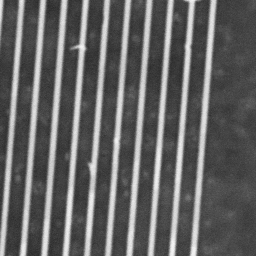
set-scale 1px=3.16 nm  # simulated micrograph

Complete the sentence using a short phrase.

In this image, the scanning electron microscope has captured parallel lines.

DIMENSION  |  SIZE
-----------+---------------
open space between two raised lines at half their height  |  53.9 nanometers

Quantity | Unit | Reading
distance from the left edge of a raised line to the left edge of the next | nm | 67.1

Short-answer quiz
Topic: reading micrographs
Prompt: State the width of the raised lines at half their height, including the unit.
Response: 11.8 nm